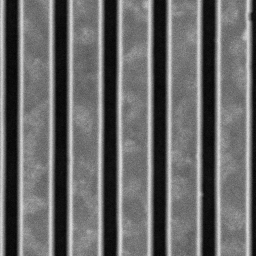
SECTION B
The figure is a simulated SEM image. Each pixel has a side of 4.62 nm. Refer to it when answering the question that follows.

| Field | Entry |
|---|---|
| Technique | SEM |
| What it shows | parallel lines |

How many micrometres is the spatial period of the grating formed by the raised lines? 0.228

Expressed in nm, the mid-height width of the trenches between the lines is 74.6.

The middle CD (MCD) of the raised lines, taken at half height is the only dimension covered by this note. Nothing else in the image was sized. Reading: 153 nanometres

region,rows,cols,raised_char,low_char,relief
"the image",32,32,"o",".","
...oooo..oooo..oooo..oooo..oooo.
...oooo..oooo..oooo..oooo..oooo.
...oooo..oooo..oooo..oooo..oooo.
...oooo..oooo..oooo..oooo..oooo.
...oooo..oooo..oooo..oooo..oooo.
...oooo..oooo..oooo..oooo..oooo.
...oooo..oooo..oooo..oooo..oooo.
...oooo..oooo..oooo..oooo..oooo.
...oooo..oooo..oooo..oooo..oooo.
...oooo..oooo..oooo..oooo..oooo.
...oooo..oooo..oooo..oooo..oooo.
...oooo..oooo..oooo..oooo..oooo.
...oooo..oooo..oooo..oooo..oooo.
...oooo..oooo..oooo..oooo..oooo.
...oooo..oooo..oooo..oooo..oooo.
...oooo..oooo..oooo..oooo..oooo.
...oooo..oooo..oooo..oooo..oooo.
...oooo..oooo..oooo..oooo..oooo.
...oooo..oooo..oooo..oooo..oooo.
...oooo..oooo..oooo..oooo..oooo.
...oooo..oooo..oooo..oooo..oooo.
...oooo..oooo..oooo..oooo..oooo.
...oooo..oooo..oooo..oooo..oooo.
..ooooo..oooo..oooo..oooo..oooo.
..ooooo..oooo..oooo..oooo..oooo.
..ooooo..oooo..oooo..oooo..oooo.
..ooooo..oooo..oooo..oooo..oooo.
..ooooo..oooo..oooo..oooo..oooo.
..oooo...oooo..oooo..oooo..oooo.
..oooo...oooo..oooo..oooo..oooo.
..oooo...oooo..oooo..oooo..oooo.
..oooo...oooo..oooo..oooo..oooo.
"